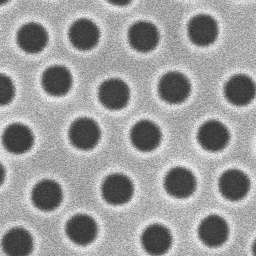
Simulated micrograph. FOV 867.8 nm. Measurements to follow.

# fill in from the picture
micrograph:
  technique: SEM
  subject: a regular array of holes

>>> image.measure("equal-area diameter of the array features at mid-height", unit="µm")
0.107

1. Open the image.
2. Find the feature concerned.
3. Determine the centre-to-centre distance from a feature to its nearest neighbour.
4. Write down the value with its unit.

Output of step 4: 177 nm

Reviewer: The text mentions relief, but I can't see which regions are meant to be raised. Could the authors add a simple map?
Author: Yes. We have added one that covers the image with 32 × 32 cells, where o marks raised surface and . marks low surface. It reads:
oooooooooooooo..oooooooooooooooo
oooooooooooooooooooooooooooooooo
oooooooooo.ooooooooooooo...ooooo
ooo..oooo...oooo....oooo...ooooo
oo....ooo...oooo....oooo...ooooo
oo....ooo...oooo....oooo..oooooo
ooo..ooooooooooooooooooooooooooo
oooooooooooooooooooooooooooooooo
oooooo..oooooooooooooooooooooooo
.oooo....ooooooooooo...oooooo..o
..ooo....oooo...oooo....oooo....
..oooo..oooo....oooo....oooo....
.ooooooooooo....oooo...ooooo....
ooooooooooooo..ooooooooooooooooo
oooooooooooooooooooooooooooooooo
o..oooooo...ooooo..oooooo...oooo
....ooooo...oooo....ooooo....ooo
....ooooo...oooo....ooooo....ooo
o...oooooo..ooooo..oooooo...oooo
oooooooooooooooooooooooooooooooo
oooooooooooooooooooooooooooooooo
.oooooooooooooooooooo...oooo..oo
ooooo.ooooooo...ooooo...ooo....o
oooo....ooooo....oooo...ooo....o
oooo....ooooo....ooooo..oooo...o
oooo...ooooooo.ooooooooooooooooo
oooooooooooooooooooooooooooooooo
ooooooooo...ooooooooooooo...oooo
oo.ooooo....oooooo...oooo...oooo
....oooo....oooooo...oooo...oooo
....oooooo.ooooooo...ooooo..oooo
o...oooooooooooooo...ooooooooooo